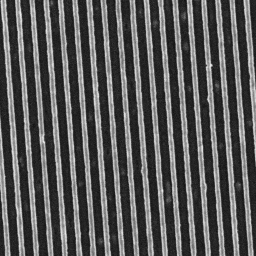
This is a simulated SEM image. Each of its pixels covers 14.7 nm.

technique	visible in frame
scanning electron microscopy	parallel lines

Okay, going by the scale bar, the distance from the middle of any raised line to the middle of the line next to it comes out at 0.209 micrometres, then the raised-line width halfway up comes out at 58.5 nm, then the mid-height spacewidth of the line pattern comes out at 0.142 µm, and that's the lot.